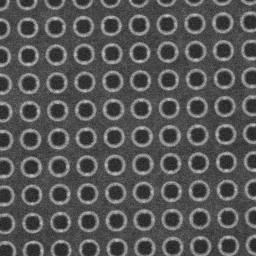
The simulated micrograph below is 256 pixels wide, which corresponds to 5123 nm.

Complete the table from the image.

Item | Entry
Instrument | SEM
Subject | an array of small figures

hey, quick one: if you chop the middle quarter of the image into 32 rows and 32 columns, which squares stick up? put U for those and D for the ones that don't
DDDDDDDDDDDDDDDDDDDDDDDDDDDDDDDD
DDDDDDDDDDDDDDDDDDDDDDDDDDDDDDDD
DDDDUUUDDDUUUUDDDUUUUDDDUUUUDDDU
DDDUUUUUDDUUUUUDDUUUUUDDUUUUUDDU
UDDUUUUUDDUUUUUDDUUUUUDDUUUUUDDU
UDDUUUUDDDUUUUUDDUUUUDDDUUUUDDDU
DDDDUUUDDDDUUUDDDDUUDDDDDDDDDDDD
DDDDDDDDDDDDDDDDDDDDDDDDDDDDDDDD
DDDDDDDDDDDDDDDDDDDDDDDDDDDDDDDD
DDDDUUUDDDDUUUDDDUUUUDDDUUUUDDDU
UDDUUUUUDDUUUUUDDUUUUUDDUUUUUDDU
UDDUUUUUDDUUUUUDDUUUUUDDUUUUUDDU
UDDUUUUUDDUUUUUDDUUUUUDDUUUUDDDU
DDDDUUUDDDDUUUDDDDUUDDDDDDDDDDDD
DDDDDDDDDDDDDDDDDDDDDDDDDDDDDDDD
DDDDDDDDDDDDDDDDDDDDDDDDDDUDDDDD
DDDDUUUDDDDUUUDDDDUUUDDDUUUUUDDU
UDDUUUUUDDUUUUUDDUUUUUDDUUUUUDDU
UDDUUUUUDDUUUUUDDUUUUUDDUUUUUDDU
UDDUUUUUDDUUUUUDDUUUUUDDUUUUUDDD
DDDDUUUDDDDUUUDDDDDUDDDDDDDDDDDD
DDDDDDDDDDDDDDDDDDDDDDDDDDDDDDDD
DDDDDDDDDDDDDDDDDDDDDDDDDDUDDDDD
DDDDUUUDDDDUUUUDDDUUUUDDDUUUUDDU
UDDUUUUUDDUUUUUDDUUUUUDDUUUUUDDU
UDDUUUUUDDUUUUUDDUUUUUDDUUUUUDDU
UDDUUUUUDDUUUUUDDDUUUUDDDUUUUDDD
UDDDUUUDDDDDUUDDDDDUUDDDDDDDDDDD
DDDDDDDDDDDDDDDDDDDDDDDDDDDDDDDD
DDDDDDDDDDDDDDDDDDDDDDDDDDUDDDDD
DDDDUUUUDDDUUUUDDDUUUUDDDUUUUDDD
UDDDUUUUDDUUUUUDDUUUUUDDUUUUUDDU